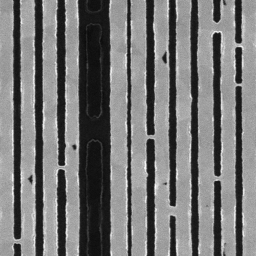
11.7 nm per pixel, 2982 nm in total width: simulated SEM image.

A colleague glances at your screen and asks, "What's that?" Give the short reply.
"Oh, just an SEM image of parallel lines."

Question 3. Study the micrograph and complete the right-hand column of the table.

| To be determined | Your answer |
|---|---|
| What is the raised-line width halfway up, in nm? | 169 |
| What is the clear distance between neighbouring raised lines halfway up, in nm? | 91.7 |